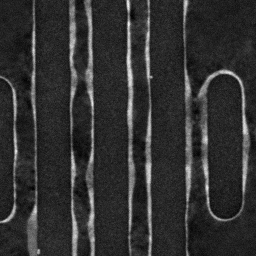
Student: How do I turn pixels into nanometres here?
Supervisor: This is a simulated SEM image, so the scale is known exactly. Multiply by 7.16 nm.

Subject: groups of lines, slits or small figures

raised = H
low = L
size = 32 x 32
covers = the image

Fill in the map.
HHHHLLLLLHHLLLLLHHHLLLLHHHHHHHHH
HHHHLLLLLHHLLLLLHHHLLLLHHHHHHHHH
HHHHLLLLLHHLLLLLHHHLLLLHHHHHHHHH
HHHHLLLLLHHLLLLLHHHLLLLHHHHHHHHH
HHHHLLLLLHHLLLLLHHLLLLLHHHHHHHHH
HHHHLLLLLHHLLLLLHHLLLLLHHHHHHHHH
HHHHLLLLLHHLLLLLHHLLLLLHHHHHHHHH
HHHHLLLLLHHLLLLLHHLLLLLHHHHHHHHH
HHHHLLLLLHHLLLLLHHLLLLLHHHHHHHHH
HHHHLLLLLHHLLLLLHHHLLLLHHHHLLHHH
LHHHLLLLLHHLLLLLHHHLLLLHHHLLLLHH
LLHHLLLLLHHLLLLLHHHLLLLLHLLLLLHH
LLHHLLLLLHHHLLLLHHHLLLLLHLLLLLHH
LLHHLLLLLHHHLLLLHHHLLLLLHLLLLLHH
LLHHLLLLLHHHLLLLHHHLLLLLHLLLLLHH
LLHHLLLLLHHHLLLLHHHLLLLLHHLLLLLH
LLHHLLLLLHHHLLLLHHHLLLLLHHLLLLLH
LLHHLLLLLHHHLLLLHHHLLLLLHHLLLLLH
LLHHLLLLLHHHLLLLHHLLLLLLHHLLLLLH
LLHHLLLLLHHHLLLLHHHLLLLLHHLLLLLH
LLHHLLLLLHHLLLLLHHHLLLLLHHLLLLLH
LLHHHLLLLHHLLLLLHHHLLLLLHHLLLLLH
LLHHHLLLLHHLLLLLHHHLLLLLHHLLLLHH
LLHHHLLLLHHLLLLLHHHLLLLLHHLLLLHH
LLHHHLLLLHHLLLLLHHHLLLLLHHLLLLHH
LLHHHLLLLHHHLLLLHHHLLLLHHHLLLLHH
LLHHLLLLLHHHLLLLHHHLLLLHHHLLLLHH
LHHHLLLLLHHHLLLLHHHLLLLHHHHHHHHH
HHHHLLLLLHHLLLLLHHHLLLLHHHHHHHHH
HHHHLLLLLHHHLLLLHHHLLLLHHHHHHHHH
HHHHLLLLLHHHLLLLHHHLLLLHHHHHHHHH
HHHHLLLLLHHHLLLLHHHLLLLHHHHHHHHH